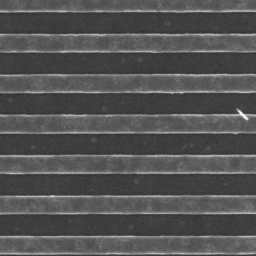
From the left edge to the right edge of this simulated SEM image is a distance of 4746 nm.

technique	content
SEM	parallel lines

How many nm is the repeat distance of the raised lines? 748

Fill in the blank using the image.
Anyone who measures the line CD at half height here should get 338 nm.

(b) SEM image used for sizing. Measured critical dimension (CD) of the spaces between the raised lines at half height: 0.408 µm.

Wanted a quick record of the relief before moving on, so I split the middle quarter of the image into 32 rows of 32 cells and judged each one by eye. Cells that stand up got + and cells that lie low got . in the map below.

................................
................................
................................
++++++++++++++++++++++++++++++++
++++++++++++++++++++++++++++++++
++++++++++++++++++++++++++++++++
++++++++++++++++++++++++++++++++
................................
................................
................................
................................
................................
................................
++++++++++++++++++++++++++++++++
+++++.++++++++++++++++++++++++++
++++++++++++++++++++++++++++++++
++++++++++++++++++++++++++++++++
................................
................................
................................
................................
................................
................................
++++++++++++++++++++++++++++++++
++++++++++++++++++++++++++++++++
++++++++++++++++++++++++++++++++
++++++++++++++++++++++++++++++++
................................
................................
................................
................................
................................